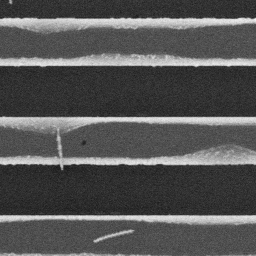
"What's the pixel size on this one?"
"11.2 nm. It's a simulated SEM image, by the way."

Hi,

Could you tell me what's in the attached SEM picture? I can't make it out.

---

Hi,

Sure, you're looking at lines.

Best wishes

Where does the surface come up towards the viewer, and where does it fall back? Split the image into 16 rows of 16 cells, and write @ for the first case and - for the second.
----------------
@@@@@@@@@@@@@@@@
@@@@@@@@@@@@@@@@
@@@@@@@@@@@@@@@@
----------------
----------------
----------------
@----@@@@@@@@@@@
@@@@@@@@@@@@@@@@
@@@@@@@@@@@@@@@@
----------------
----------------
----------------
----------------
@@@@@@@@@@@@@@@@
@@@@@@@@@@@@@@@@